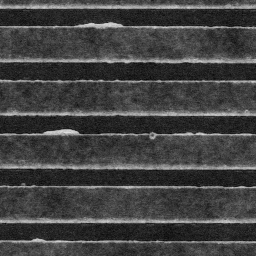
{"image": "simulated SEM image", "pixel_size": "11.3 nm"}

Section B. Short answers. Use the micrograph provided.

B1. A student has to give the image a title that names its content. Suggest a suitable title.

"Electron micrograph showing lines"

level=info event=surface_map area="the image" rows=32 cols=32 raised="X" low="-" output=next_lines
XXXXXXXXXXXXXXXXXXXXXXXXXXXXXXXX
--------------------------------
--------------------------------
XXXXXXXXXXXXXXXXXXXXXXXXXXXXXXXX
XXXXXXXXXXXXXXXXXXXXXXXXXXXXXXXX
XXXXXXXXXXXXXXXXXXXXXXXXXXXXXXXX
XXXXXXXXXXXXXXXXXXXXXXXXXXXXXXXX
XXXXXXXXXXXXXXXXXXXXXXXXXXXXXXXX
--------------------------------
--------------------------------
XXXXXXXXXXXXXXXXXXXXXXXXXXXXXXXX
XXXXXXXXXXXXXXXXXXXXXXXXXXXXXXXX
XXXXXXXXXXXXXXXXXXXXXXXXXXXXXXXX
XXXXXXXXXXXXXXXXXXXXXXXXXXXXXXXX
--------------------------------
--------------------------------
------XXX-----------------------
XXXXXXXXXXXXXXXXXXXXXXXXXXXXXXXX
XXXXXXXXXXXXXXXXXXXXXXXXXXXXXXXX
XXXXXXXXXXXXXXXXXXXXXXXXXXXXXXXX
XXXXXXXXXXXXXXXXXXXXXXXXXXXXXXXX
--------------------------------
--------------------------------
XXXXXXXXXXXXXXXXXXXXXXXXXXXXXXXX
XXXXXXXXXXXXXXXXXXXXXXXXXXXXXXXX
XXXXXXXXXXXXXXXXXXXXXXXXXXXXXXXX
XXXXXXXXXXXXXXXXXXXXXXXXXXXXXXXX
XXXXXXXXXXXXXXXXXXXXXXXXXXXXXXXX
--------------------------------
--------------------------------
XXXXXXXXXXXXXXXXXXXXXXXXXXXXXXXX
XXXXXXXXXXXXXXXXXXXXXXXXXXXXXXXX